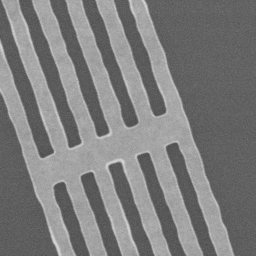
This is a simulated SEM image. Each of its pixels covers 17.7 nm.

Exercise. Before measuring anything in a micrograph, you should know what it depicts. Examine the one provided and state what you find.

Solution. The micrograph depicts groups of lines, slits or small figures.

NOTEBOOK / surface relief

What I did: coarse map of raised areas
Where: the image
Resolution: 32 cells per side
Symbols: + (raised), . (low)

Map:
++..++..++..++..++..............
.++..++..++.+++..+..............
.++..++..++..++..++.............
.++..++..++..++..++.............
..++..++..++..++..++............
..++..++..++..++..++............
..++..++..++..++..+++...........
+..++..++..++..++..++...........
+..++..++..++..++..++...........
+...++..++.+++.+++.++...........
++..++..++..++..++..++..........
++..++..++..++..++..++..........
.++..++.++..+++.++...++.........
.++..++..++..++..++..++.........
.++..++..++..++..++++++.........
..++..++..++.+++.+++++++........
..++..++..++..++++++++++........
..++..++..++++++++++++++........
...++..++++++++++++++.+++.......
...++.+++++++++++..++..++.......
...+++++++++++.++..++..++.......
....++++++++++..++.+++..++......
....++++++..++..++..++..++......
....+++.++..++..++..++..++......
.....++..++..++..++..++..++.....
.....++..++..++..++..++..++.....
......++.+++.++..++..++..+++....
......++..++..++..++..++..++....
......++..++..++..++..++..++....
.......++.+++.++..++..++..++....
.......++..++..++..++..++..++...
.......++..++..++..++..++..++...